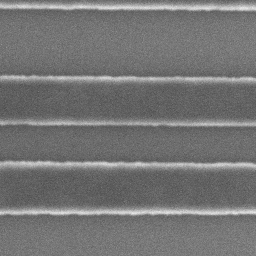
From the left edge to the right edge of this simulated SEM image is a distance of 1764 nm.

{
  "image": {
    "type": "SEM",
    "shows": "lines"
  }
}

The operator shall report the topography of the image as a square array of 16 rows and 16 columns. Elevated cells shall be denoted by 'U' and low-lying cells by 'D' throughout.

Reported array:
UUUUUUUUUUUUUUUU
DDDDDDDDDDDDDDDD
DDDDDDDDDDDDDDDD
DDDDDDDDDDDDDDDD
DDDDDDDDDDDDDDDD
UUUUUUUUUUUUUUUU
UUUUUUUUUUUUUUUU
UUUUUUUUUUUUUUUU
DDDDDDDDDDDDDDDD
DDDDDDDDDDDDDDDD
UUUUUUUUUUUUUUUU
UUUUUUUUUUUUUUUU
UUUUUUUUUUUUUUUU
DDDDDDDDDDDDDDDD
DDDDDDDDDDDDDDDD
DDDDDDDDDDDDDDDD